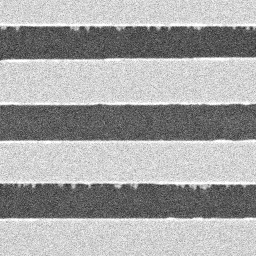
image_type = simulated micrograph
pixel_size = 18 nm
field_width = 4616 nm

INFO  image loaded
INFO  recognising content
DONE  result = lines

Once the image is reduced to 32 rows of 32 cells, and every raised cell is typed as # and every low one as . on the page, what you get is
################################
################################
################################
................................
................................
................................
................................
.............###################
################################
################################
################################
################################
################################
................................
................................
................................
................................
................................
################################
################################
################################
################################
################################
................................
................................
................................
................................
################################
################################
################################
################################
################################